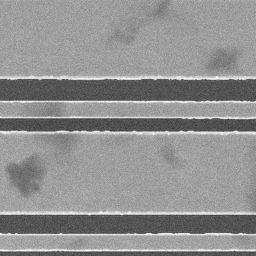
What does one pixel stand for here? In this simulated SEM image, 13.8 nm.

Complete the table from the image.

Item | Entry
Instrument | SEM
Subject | lines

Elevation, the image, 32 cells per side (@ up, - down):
@@@@@@@@@@@@@@@@@@@@@@@@@@@@@@@@
@@@@@@@@@@@@@@@@@@@@@@@@@@@@@@@@
@@@@@@@@@@@@@@@@@@@@@@@@@@@@@@@@
@@@@@@@@@@@@@@@@@@@@@@@@@@@@@@@@
@@@@@@@@@@@@@@@@@@@@@@@@@@@@@@@@
@@@@@@@@@@@@@@@@@@@@@@@@@@@@@@@@
@@@@@@@@@@@@@@@@@@@@@@@@@@@@@@@@
@@@@@@@@@@@@@@@@@@@@@@@@@@@@@@@@
@@@@@@@@@@@@@@@@@@@@@@@@@@@@@@@@
@@@@@@@@@@@@@@@@@@@@@@@@@@@@@@@@
--------------------------------
--------------------------------
--------------------------------
@@@@@@@@@@@@@@@@@@@@@@@@@@@@@@@@
@@@@@@@@@@@@@@@@@@@@@@@@@@@@@@@@
--------------------------------
@------@------------------------
@@@@@@@@@@@@@@@@@@@@@@@@@@@@@@@@
@@@@@@@@@@@@@@@@@@@@@@@@@@@@@@@@
@@@@@@@@@@@@@@@@@@@@@@@@@@@@@@@@
@@@@@@@@@@@@@@@@@@@@@@@@@@@@@@@@
@@@@@@@@@@@@@@@@@@@@@@@@@@@@@@@@
@@@@@@@@@@@@@@@@@@@@@@@@@@@@@@@@
@@@@@@@@@@@@@@@@@@@@@@@@@@@@@@@@
@@@@@@@@@@@@@@@@@@@@@@@@@@@@@@@@
@@@@@@@@@@@@@@@@@@@@@@@@@@@@@@@@
@@@@@@@@@@@@@@@@@@@@@@@@@@@@@@@@
--------------------------------
--------------------------------
@@@@@@@@@@@@@@@@@@@@@@@@@@@@@@@@
@@@@@@@@@@@@@@@@@@@@@@@@@@@@@@@@
--------------------------------